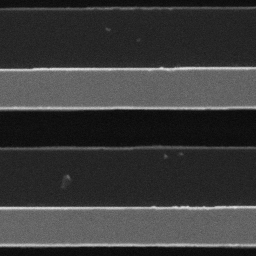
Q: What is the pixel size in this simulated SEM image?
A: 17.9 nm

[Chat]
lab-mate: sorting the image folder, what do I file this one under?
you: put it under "lines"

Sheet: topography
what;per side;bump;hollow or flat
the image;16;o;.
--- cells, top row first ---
...............o
oooooooooooooooo
oooooooooooooooo
oooooooooooooooo
oooooooooooooooo
oooooooooooooooo
oooooooooooooooo
................
................
oooooooooooooooo
oooooooooooooooo
oooooooooooooooo
oooooooooooooooo
oooooooooooooooo
oooooooooooooooo
................